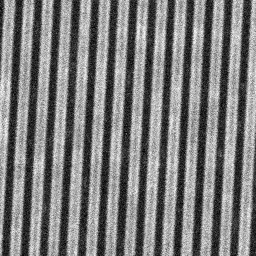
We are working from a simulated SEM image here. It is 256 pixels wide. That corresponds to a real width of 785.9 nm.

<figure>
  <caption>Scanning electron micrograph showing parallel lines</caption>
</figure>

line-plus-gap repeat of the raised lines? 0.0583 microns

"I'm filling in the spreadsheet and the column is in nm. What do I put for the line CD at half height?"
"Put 29.5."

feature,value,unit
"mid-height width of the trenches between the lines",26.4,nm